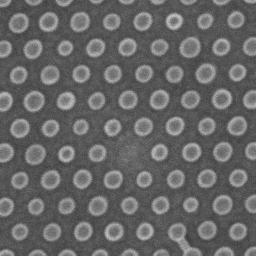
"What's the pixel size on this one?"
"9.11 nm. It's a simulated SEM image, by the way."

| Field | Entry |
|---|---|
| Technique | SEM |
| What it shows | a regular array of raised bodies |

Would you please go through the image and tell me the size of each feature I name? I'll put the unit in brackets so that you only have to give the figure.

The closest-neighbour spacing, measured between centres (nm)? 273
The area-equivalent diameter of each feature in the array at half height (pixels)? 16.8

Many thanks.